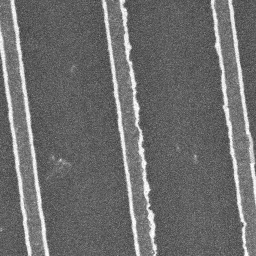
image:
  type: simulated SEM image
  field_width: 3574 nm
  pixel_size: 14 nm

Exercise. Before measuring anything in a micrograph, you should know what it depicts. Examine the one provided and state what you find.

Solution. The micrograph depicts one or a few lines or trenches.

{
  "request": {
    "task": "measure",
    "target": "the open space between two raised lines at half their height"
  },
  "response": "1.25 um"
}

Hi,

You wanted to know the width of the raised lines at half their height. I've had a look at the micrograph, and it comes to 240 nm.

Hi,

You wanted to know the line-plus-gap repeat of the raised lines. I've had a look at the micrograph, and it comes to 1500 nanometers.